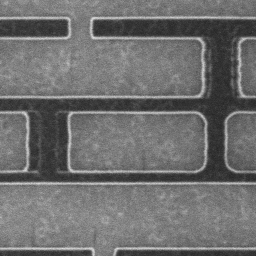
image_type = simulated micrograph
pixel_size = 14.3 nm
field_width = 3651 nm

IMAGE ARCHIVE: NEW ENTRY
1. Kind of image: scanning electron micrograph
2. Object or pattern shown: one or a few lines or trenches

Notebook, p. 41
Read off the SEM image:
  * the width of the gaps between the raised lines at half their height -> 838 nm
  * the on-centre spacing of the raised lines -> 1060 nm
